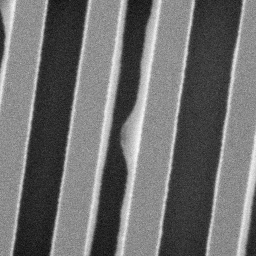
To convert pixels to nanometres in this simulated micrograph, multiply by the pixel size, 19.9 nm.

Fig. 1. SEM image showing lines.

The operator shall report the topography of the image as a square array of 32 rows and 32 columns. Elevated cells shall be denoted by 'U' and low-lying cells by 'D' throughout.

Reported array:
DUUUUUDDDDDUUUUDDDDDUUUUDDDDDDUU
DUUUUUDDDDDUUUUDDDDDUUUUDDDDDDUU
DUUUUUDDDDDUUUUDDDDUUUUUDDDDDDUU
DUUUUDDDDDDUUUUDDDDUUUUUDDDDDDUU
DUUUUDDDDDDUUUUDDDDUUUUUDDDDDDUU
DUUUUDDDDDUUUUUDDDDUUUUDDDDDDDUU
DUUUUDDDDDUUUUUDDDDUUUUDDDDDDDUU
DUUUUDDDDDUUUUDDDDDUUUUDDDDDDUUU
UUUUUDDDDDUUUUDDDDUUUUUDDDDDDUUU
UUUUUDDDDDUUUUDDDDUUUUUDDDDDDUUU
UUUUDDDDDDUUUUDDDDUUUUUDDDDDDUUU
UUUUDDDDDDUUUUDDDDUUUUUDDDDDDUUU
UUUUDDDDDUUUUUDDDDUUUUDDDDDDDUUU
UUUUDDDDDUUUUUDDDDUUUUDDDDDDDUUU
UUUUDDDDDUUUUDDDDUUUUUDDDDDDUUUU
UUUUDDDDDUUUUDDDDUUUUUDDDDDDUUUU
UUUUDDDDDUUUUDDDDUUUUUDDDDDDUUUU
UUUDDDDDDUUUUDDDDUUUUUDDDDDDUUUU
UUUDDDDDUUUUUDDDDUUUUUDDDDDDUUUU
UUUDDDDDUUUUUDDDDUUUUDDDDDDDUUUU
UUUDDDDDUUUUDDDDDUUUUDDDDDDUUUUU
UUUDDDDDUUUUDDDDDUUUUDDDDDDUUUUU
UUUDDDDDUUUUDDDDUUUUUDDDDDDUUUUD
UUUDDDDDUUUUDDDDUUUUUDDDDDDUUUUD
UUUDDDDDUUUUDDDDUUUUUDDDDDDUUUUD
UUDDDDDUUUUUDDDDUUUUUDDDDDDUUUUD
UUDDDDDUUUUUDDDDUUUUDDDDDDDUUUUD
UUDDDDDUUUUDDDDDUUUUDDDDDDDUUUUD
UUDDDDDUUUUDDDDDUUUUDDDDDDUUUUDD
UUDDDDDUUUUDDDDUUUUUDDDDDDUUUUDD
UUDDDDDUUUUDDDDUUUUUDDDDDDUUUUDD
UUDDDDDUUUUDDDDUUUUUDDDDDDUUUUDD